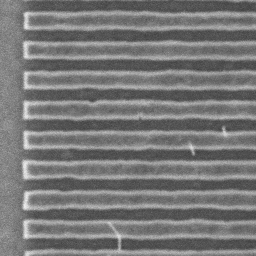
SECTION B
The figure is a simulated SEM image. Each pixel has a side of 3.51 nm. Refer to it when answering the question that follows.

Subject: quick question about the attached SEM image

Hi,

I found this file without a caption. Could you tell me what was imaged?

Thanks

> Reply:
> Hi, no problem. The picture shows parallel lines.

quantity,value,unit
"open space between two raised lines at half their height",15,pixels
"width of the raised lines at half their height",52.6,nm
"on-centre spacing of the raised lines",29.7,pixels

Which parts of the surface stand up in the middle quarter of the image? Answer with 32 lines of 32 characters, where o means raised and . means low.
................................
................................
oooooooooooooooooooo..oooooooooo
oooooooooooooooooooooooooooooooo
oooooooooooooooooooooooooooooooo
oooooooooooooooooooooooooooooooo
................................
................................
................................
...................o.o..........
oooooooooooooooooooooooooooooooo
oooooooooooooooooooooooooooooooo
oooooooooooooooooooooooooooooooo
..oooo....o.....................
................................
................................
................................
oooooooooooooooooooooooooooooooo
oooooooooooooooooooooooooooooooo
oooooooooooooooooooooooooooooooo
oooooooooooooooooooooooooooooooo
................................
................................
................................
.......o......o.................
oooooooooooooooooooooooooooooooo
oooooooooooooooooooooooooooooooo
oooooooooooooooooooooooooooooooo
................................
................................
................................
................................